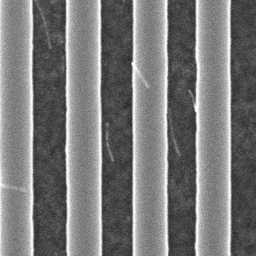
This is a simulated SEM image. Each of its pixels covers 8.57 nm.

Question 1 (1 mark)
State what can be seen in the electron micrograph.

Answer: lines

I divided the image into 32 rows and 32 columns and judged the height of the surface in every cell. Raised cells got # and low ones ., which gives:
####....####.....####....####...
####....####.....####....####...
####....####.....####....####...
####....####.....####....####...
####....####.....####....####...
####....####.....####....####...
####....####.....####....####...
####....####.....####....####...
####....####.....####....####...
####....####.....####....####...
####....####.....####....####...
####....####.....####....####...
####....####.....####....####...
####....####.....####...#####...
####....#####....####....####...
####....#####....####....####...
####....#####....####....####...
####....#####....####....####...
####....#####....####....####...
####....#####....####....####...
####....#####....####....####...
####....#####....####....####...
####....#####....####....####...
####....#####....####....####...
####....#####....####....####...
####....#####....####....####...
####....#####....####....####...
####....#####....####....####...
####....#####....####....####...
####....#####....####....####...
####....#####....####...#####...
####....#####....####....####...